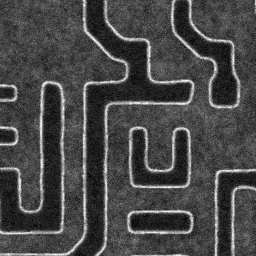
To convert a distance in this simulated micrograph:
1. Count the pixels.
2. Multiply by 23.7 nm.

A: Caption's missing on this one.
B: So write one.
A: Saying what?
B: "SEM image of wiring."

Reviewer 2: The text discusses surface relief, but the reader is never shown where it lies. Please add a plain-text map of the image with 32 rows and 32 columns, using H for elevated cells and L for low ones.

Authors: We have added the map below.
LLLLLLLLLLLHHLLLLLLLLLHHLLLLLLLL
LLLLLLLLLLHHHLLLLLLLLLHHLLLLLLLL
LLLLLLLLLLLHHLLLLLLLLLHHLLLLLLLL
LLLLLLLLLLLHHHLLLLLLLLHHLLLLLLLL
LLLLLLLLLLLHHHHLLLLLLLHHHLLLLLLL
LLLLLLLLLLLLHHHHHHHLLLLHHHHHHLLL
LLLLLLLLLLLLLHHHHHHLLLLLHHHHHLLL
LLLLLLLLLLLLLLHHHHHLLLLLLLHHHLLL
LLLLLLLLLLLLLLLLHHHLLLLLLLLHHLLL
LLLLLLLLLLLLLLLLHHHLLLLLLLLHHHLL
LLLLLLHLLLLHHHHHHHHHHHHHLLHHHHLL
HHLLLHHHLLLHHHHHHHHHHHHHLLHHHHLL
HLLLLHHHLLLHHHHHHHHHHHHHLLHHHHLL
LLLLLHHHLLLHHLLLLLLLLLLLLLLLLLLL
LLLLLHHHLLLHHLLLLLLLLLLLLLLLLLLL
LLLLLHHHLLLHHLLLLLLLLLLLLLLLLLLL
HHLLLHHHLLLHHLLLHHLLLLHHLLLLLLLL
HHLLLHHHLLLHHLLLHHLLLLHHLLLLLLLL
LLLLLHHHLLLHHLLLHHLLLLHHLLLLLLLL
LLLLLHHHLLHHHLLLHHLLLLHHLLLLLLLL
LLLLLHHHLLHHHLLLHHLLLLHHLLLLLLLL
HHLLLHHHLLLHHLLLHHHHHHHHLLLHHHHH
HHLLLHHHLLHHHLLLHHHHHHHHLLLHHHHH
HHLLLHHHLLHHHLLLLLLLLLLLLLLHHHLH
HHHLLHHHLLLHHLLLLLLLLLLLLLLHHLLL
HHHLLHHHLLLHHLLLLLLLLLLLLLLHHLLL
HHHHHHHHLLLHHLLLLHHHHHHLLLLHHLLL
HHHHHHHHLLLHHLLLHHHHHHHHLLLHHLLL
HHHHHHHHLLLHHLLLHHHHHHHHLLLHHLLL
LLLLLLLLLLHHHLLLLLLLLLLLLLLHHLLL
LLLLLLLLLLHHHLLLLLLLLLLLLLLHHLLL
LLLLLLLLLHHHHLLLLLLLLLLLLLLHHLLL